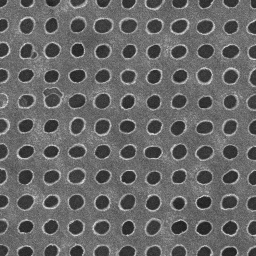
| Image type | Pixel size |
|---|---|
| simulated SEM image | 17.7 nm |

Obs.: a regular array of holes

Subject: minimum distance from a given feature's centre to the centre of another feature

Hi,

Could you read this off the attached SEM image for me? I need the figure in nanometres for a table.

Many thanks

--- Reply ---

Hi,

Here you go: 440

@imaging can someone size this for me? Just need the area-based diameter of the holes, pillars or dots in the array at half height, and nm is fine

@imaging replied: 256